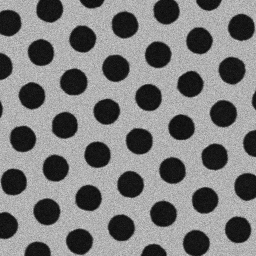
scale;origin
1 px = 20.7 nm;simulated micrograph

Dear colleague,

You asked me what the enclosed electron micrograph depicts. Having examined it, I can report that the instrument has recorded a regular array of holes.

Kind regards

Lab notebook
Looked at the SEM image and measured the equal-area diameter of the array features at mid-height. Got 0.556 um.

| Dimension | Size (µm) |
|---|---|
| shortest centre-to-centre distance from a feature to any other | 0.909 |